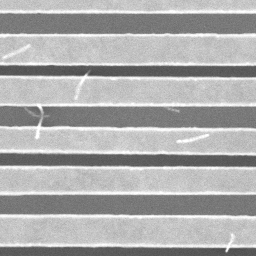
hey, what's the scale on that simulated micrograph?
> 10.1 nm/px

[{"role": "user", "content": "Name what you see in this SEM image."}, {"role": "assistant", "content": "lines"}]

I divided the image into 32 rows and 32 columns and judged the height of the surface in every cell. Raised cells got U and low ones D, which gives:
UUUUUUUUUUUUUUUUUUUUUUUUUUUUUUUU
UUUUUUUUUUUUUUUUUUUUUUUUUUUUUUUU
DDDDDDDDDDDDDDDDDDDDDDDDDDDDDDDD
DDDDDDDDDDDDDDDDDDDDDDDDDDDDDDDD
UUUUUUUUUUUUUUUUUUUUUUUUUUUUUUUU
UUUUUUUUUUUUUUUUUUUUUUUUUUUUUUUU
UUUUUUUUUUUUUUUUUUUUUUUUUUUUUUUU
UUUUUUUUUUUUUUUUUUUUUUUUUUUUUUUU
DDDDDDDDDDDDDDDDDDDDDDDDDDDDDDDD
DDDDDDDDDDUDDDDDDDDDDDDDDDDDDDDD
UUUUUUUUUUUUUUUUUUUUUUUUUUUUUUUU
UUUUUUUUUUUUUUUUUUUUUUUUUUUUUUUU
UUUUUUUUUUUUUUUUUUUUUUUUUUUUUUUU
DDDDDDDDDDDDDDDDDDDDDDDDDDDDDDDD
DDDDDDDDDDDDDDDDDDDDDDDDDDDDDDDD
DDDDDDDDDDDDDDDDDDDDDDDDDDDDDDDD
UUUUUUUUUUUUUUUUUUUUUUUUUUUUUUUU
UUUUUUUUUUUUUUUUUUUUUUUUUUUUUUUU
UUUUUUUUUUUUUUUUUUUUUUUUUUUUUUUU
DDDDDDDDDDDDDDDDDDDDDDDDDDDDDDDD
DDDDDDDDDDDDDDDDDDDDDDDDDDDDDDDD
UUUUUUUUUUUUUUUUUUUUUUUUUUUUUUUU
UUUUUUUUUUUUUUUUUUUUUUUUUUUUUUUU
UUUUUUUUUUUUUUUUUUUUUUUUUUUUUUUU
DDDDDDDDDDDDDDDDDDDDDDDDDDDDDDDD
DDDDDDDDDDDDDDDDDDDDDDDDDDDDDDDD
DDDDDDDDDDDDDDDDDDDDDDDDDDDDDDDD
UUUUUUUUUUUUUUUUUUUUUUUUUUUUUUUU
UUUUUUUUUUUUUUUUUUUUUUUUUUUUUUUU
UUUUUUUUUUUUUUUUUUUUUUUUUUUUUUUU
UUUUUUUUUUUUUUUUUUUUUUUUUUUUUUUU
DDDDDDDDDDDDDDDDDDDDDDDDDDDDDDDD